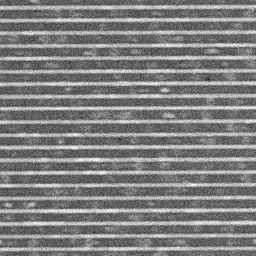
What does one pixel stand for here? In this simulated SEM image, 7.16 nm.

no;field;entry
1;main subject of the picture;parallel lines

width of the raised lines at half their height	21.5	nm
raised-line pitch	90.8	nanometers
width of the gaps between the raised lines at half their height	0.0707	µm